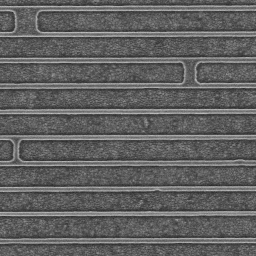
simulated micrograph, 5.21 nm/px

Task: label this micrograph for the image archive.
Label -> parallel lines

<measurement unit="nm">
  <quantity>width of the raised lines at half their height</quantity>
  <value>25.4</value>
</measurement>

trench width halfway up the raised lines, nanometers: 112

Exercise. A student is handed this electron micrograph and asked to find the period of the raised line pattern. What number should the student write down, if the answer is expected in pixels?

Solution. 25.8